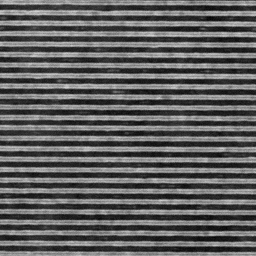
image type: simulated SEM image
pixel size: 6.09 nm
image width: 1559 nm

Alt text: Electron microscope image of parallel lines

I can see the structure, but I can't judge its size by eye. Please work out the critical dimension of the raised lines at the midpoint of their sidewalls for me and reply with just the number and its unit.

0.0213 micrometres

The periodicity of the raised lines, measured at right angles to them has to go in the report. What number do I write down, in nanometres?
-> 63.8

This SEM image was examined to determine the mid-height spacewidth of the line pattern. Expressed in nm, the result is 42.6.